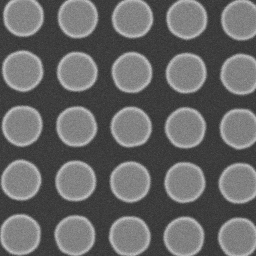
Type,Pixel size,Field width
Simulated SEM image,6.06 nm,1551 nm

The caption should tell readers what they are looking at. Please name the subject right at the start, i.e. an array of small figures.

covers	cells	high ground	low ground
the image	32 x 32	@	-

-@@@@---@@@@---@@@----@@@----@@@
-@@@@--@@@@@--@@@@@--@@@@@--@@@@
-@@@@--@@@@@--@@@@@--@@@@@--@@@@
-@@@@---@@@@--@@@@@--@@@@@--@@@@
---------@@-----@@----@@@----@@@
--------------------------------
--@-----------------------------
-@@@@---@@@@---@@@----@@@---@@@@
@@@@@--@@@@@--@@@@@--@@@@@--@@@@
@@@@@--@@@@@--@@@@@--@@@@@--@@@@
-@@@@---@@@@---@@@---@@@@---@@@@
-----------------------@-----@@-
--------------------------------
--@@-----@------@---------------
-@@@@--@@@@@--@@@@---@@@@---@@@@
@@@@@--@@@@@--@@@@@--@@@@@--@@@@
@@@@@--@@@@@--@@@@@--@@@@@--@@@@
-@@@----@@@----@@@---@@@@---@@@@
--------------------------------
--------------------------------
-@@@----@@@----@@-----@@-----@@-
@@@@@--@@@@@--@@@@---@@@@---@@@@
@@@@@--@@@@@--@@@@@--@@@@@-@@@@@
@@@@@--@@@@@--@@@@@--@@@@@-@@@@@
-@@@----@@@----@@@---@@@@---@@@@
--------------------------------
--------------------------------
-@@@----@@@----@@@----@@-----@@-
@@@@@--@@@@@--@@@@---@@@@---@@@@
@@@@@--@@@@@--@@@@@--@@@@--@@@@@
@@@@@--@@@@@--@@@@@--@@@@--@@@@@
-@@@----@@@----@@@---@@@@---@@@-